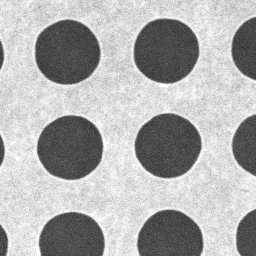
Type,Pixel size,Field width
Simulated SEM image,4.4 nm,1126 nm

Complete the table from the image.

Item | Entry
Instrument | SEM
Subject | holes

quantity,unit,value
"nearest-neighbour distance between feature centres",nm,419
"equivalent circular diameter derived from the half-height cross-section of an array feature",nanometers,291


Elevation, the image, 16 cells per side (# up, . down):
################
###..####...###.
##....##....###.
##....##....##..
###...###...###.
################
################
###...###...###.
##....###....##.
##....##.....##.
###...###...###.
################
################
###...###...###.
###...###....##.
##.....##....##.